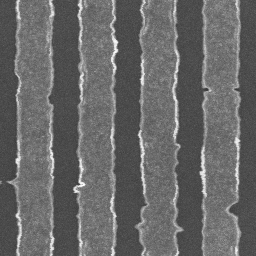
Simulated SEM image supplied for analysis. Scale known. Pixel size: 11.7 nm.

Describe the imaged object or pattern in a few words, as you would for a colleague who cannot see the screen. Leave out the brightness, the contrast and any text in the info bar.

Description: parallel lines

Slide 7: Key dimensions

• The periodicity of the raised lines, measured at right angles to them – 724 nanometres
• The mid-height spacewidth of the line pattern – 311 nanometers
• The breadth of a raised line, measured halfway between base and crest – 408 nanometers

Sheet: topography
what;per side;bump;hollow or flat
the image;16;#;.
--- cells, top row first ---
.##..##..##..##.
.##..##..##..##.
.##..##..##..##.
.##..##..##..##.
.##..##..##..##.
.##..##..##..##.
.##..##..##..##.
.##..##..##..##.
.##..##..##..##.
.##..##..##..##.
.##..##..##..##.
.##..##..##..##.
.##..##..##..##.
.##..##..##..##.
.##..##..##..##.
.##..##..##..##.